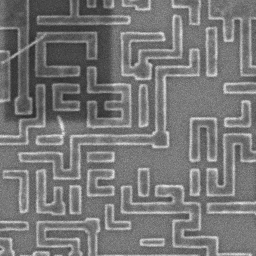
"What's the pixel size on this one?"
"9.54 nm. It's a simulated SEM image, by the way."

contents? wiring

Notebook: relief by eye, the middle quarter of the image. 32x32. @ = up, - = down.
---------------@@-@@@@---------@
@@@@--@@-------@@@@@@@-@@@@@@@@@
@@@@--@@-------@@@@@@@-@@@@@@@@@
------@@----------@@@@-@@-------
------@@---------------@@-------
@@@@--@@@@@@@@@@@--@@--@@-------
@@@@--@@@@@@@@@@@--@@--@@-------
--------------@@@--@@--@@-------
---------------@@--@@--@@-------
@@@@--@@---@@@@@@--@@--@@-------
@@@@--@@--@@@@@@@--@@--@@-------
@@@@--@@------@@@--@@--@@-------
------@@-------@@--@@--@@-------
------@@@-----@@@--@@--@@-------
------@@@@@@@@@@@--@@--@@-------
------@@@@@@@@@@@--@---@@-------
-----------------------@@-------
----------------------@@@@------
--@@@@@@@@@@@@@@@@@@@@@@@@------
--@@@@@@@@@@@@@@@@@@@@@@@@------
--@@------------------@@@@------
--@@----------------------------
--@@--@@@@@@--------------------
--@@--@@@@@@--------------------
--@@----------------------------
--@@----------------------------
-@@@---------------@@-----------
@@@@--@@@@@@-------@@-----------
@@@@--@@@@@@-------@@-----------
------@@-----------@@-----------
------@@-----------@@--@@@------
--@@--@@@@@@--@@@--@@--@@@@@@@--